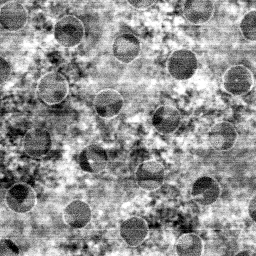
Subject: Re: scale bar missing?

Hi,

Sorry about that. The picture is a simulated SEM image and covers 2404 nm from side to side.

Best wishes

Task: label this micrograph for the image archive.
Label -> a regular array of raised bodies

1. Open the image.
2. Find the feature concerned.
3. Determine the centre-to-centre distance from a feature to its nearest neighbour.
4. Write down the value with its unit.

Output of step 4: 540 nm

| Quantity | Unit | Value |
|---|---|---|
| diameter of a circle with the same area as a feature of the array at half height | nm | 288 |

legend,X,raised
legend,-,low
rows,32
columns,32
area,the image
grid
-XX-------------XXX----XXXX-----
XXX--------------------XXXX----X
XXX----XXX-------------XXX----XX
XXX----XXX--------------------XX
-------XXX-----XX-------------XX
-------XXX----XXXX--------------
--------------XXXX----XX--------
X--------------XX----XXXX-------
X--------------------XXXX----XX-
X----XXX-------------XXX----XXXX
-----XXX--------------------XXXX
-----XXX-----XX------X------XXX-
-----XXX----XXX-----------------
------------XXX-----XX----------
------------XX-----XXXX---------
-X-----------------XXXX----XX---
---XXX--------------XX----XXXX--
---XXXX-------------------XXXX--
---XXX----XXX--------------XX---
----X-----XXX-------------------
----------XXX-----XX------------
-----------XX----XXXX-----------
-----------------XXXX----XX-----
-XXX--------------XX----XXXX----
-XXX--------------------XXX-----
-XXX----XXX--------------XX----X
--XX----XXX--------------------X
--------XXX-----XX--------------
---------X-----XXXX-------------
---------------XXX-----XX-------
XX--------------XX----XXX-------
XX--------------------XXX-----XX